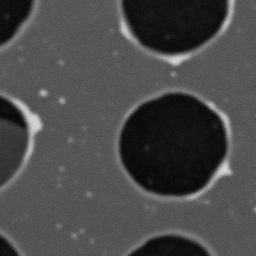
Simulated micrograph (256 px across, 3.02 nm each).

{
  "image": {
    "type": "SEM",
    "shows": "holes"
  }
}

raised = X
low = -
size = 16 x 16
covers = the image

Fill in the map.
--XXXXXX------XX
-XXXXXXX------XX
-XXXXXXXX----XXX
XXXXXXXXXXXXXXXX
XXXXXXXXXXXXXXXX
XXXXXXXXXXXXXXXX
-XXXXXXXX----XXX
--XXXXXX------XX
--XXXXXX------XX
--XXXXX-------XX
-XXXXXXX------XX
XXXXXXXXX----XXX
XXXXXXXXXXXXXXXX
XXXXXXXXXXXXXXXX
XXXXXXXXXXXXXXXX
-XXXXXXXX----XXX